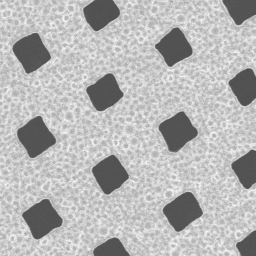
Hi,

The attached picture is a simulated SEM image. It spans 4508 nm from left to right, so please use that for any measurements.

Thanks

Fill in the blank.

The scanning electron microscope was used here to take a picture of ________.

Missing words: a regular array of holes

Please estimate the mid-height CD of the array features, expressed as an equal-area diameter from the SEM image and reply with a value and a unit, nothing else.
0.625 µm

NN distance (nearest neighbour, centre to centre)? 1440 nanometers